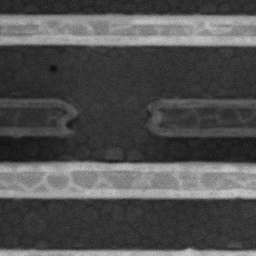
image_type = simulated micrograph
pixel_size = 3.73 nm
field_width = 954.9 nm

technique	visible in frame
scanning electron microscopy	one or a few lines or trenches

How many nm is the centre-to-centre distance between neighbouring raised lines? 281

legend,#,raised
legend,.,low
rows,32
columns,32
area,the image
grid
................................
................................
################################
################################
################################
................................
................................
................................
................................
................................
................................
................................
................................
#########..........#############
#########..........#############
########...........#############
########...........#############
................................
................................
................................
.........##....#................
################################
################################
################################
.....................#####.##...
................................
................................
................................
................................
................................
................................
......................###.......